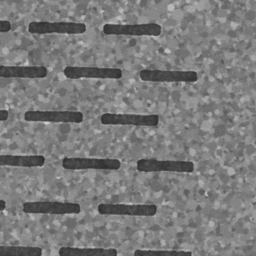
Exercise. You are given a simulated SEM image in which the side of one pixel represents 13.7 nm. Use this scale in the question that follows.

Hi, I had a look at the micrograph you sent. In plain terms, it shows a regular array of holes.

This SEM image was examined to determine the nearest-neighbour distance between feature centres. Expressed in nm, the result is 788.